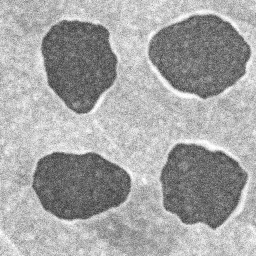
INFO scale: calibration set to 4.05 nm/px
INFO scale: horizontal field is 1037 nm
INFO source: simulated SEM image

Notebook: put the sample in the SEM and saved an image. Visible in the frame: holes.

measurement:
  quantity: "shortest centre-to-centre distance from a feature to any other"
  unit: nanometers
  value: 492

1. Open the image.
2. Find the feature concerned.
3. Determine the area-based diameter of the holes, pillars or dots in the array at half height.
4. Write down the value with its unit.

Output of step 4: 342 nm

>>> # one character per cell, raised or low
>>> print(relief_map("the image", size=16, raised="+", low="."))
++++++++++++++++
++++..+++++...++
+++....++......+
+++....++.......
+++....+++.....+
+++....++++...++
++++..++++++++++
++++++++++++++++
++++++++++++++++
+++++++++++...++
++......++.....+
++......++.....+
++......++.....+
+++...+++++...++
++++++++++++++++
++++++++++++++++